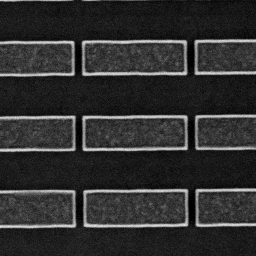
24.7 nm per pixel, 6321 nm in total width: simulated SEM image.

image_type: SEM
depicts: wiring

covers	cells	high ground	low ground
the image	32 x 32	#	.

................................
................................
................................
................................
................................
#########..############..#######
#########.#############..#######
#########.#############..#######
#########.#############..#######
................................
................................
................................
................................
................................
................................
#########..############..#######
#########..############..#######
#########..############..#######
#########..############..#######
................................
................................
................................
................................
................................
#########..############..#######
#########..############..#######
#########..############..#######
#########..############..#######
................................
................................
................................
................................